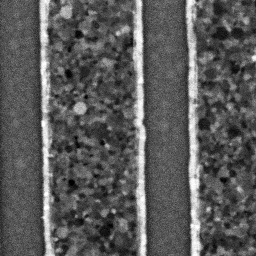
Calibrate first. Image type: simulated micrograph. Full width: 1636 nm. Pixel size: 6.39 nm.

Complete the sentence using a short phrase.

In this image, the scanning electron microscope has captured one or a few lines or trenches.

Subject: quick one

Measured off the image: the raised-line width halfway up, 612 nanometres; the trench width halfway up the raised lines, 332 nanometers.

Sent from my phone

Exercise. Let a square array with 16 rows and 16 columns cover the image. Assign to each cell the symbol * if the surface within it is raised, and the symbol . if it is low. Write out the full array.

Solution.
...******...****
...******...****
...******...****
...******...****
...******...****
...******...****
...******...****
...******...****
...******...****
...******...****
...******...****
...******...****
...******...****
...******...****
...******...****
...******...****